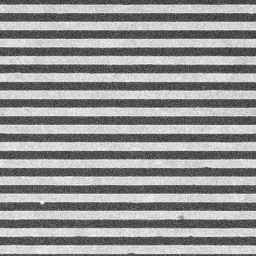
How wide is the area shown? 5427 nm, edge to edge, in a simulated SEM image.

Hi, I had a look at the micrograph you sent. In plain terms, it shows parallel lines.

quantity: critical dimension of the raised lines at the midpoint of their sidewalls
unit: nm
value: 162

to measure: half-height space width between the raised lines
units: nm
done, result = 201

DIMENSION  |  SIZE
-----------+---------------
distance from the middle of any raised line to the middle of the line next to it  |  365 nm